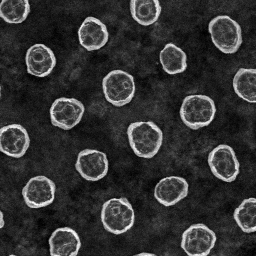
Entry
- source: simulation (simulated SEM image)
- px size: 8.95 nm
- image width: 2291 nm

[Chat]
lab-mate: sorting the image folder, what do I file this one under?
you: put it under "a regular array of raised bodies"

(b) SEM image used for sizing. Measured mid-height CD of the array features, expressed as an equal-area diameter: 270 nm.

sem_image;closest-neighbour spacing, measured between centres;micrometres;0.515